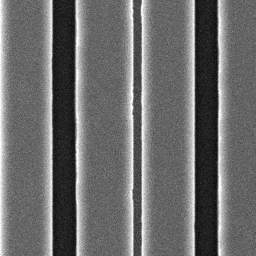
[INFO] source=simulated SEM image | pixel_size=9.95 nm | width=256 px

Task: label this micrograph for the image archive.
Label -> lines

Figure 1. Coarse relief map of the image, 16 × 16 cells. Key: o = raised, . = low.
ooo..ooooooo..oo
ooo..ooooooo..oo
ooo..ooooooo..oo
ooo..ooooooo..oo
ooo..ooooooo..oo
ooo..ooooooo..oo
ooo..ooooooo..oo
ooo..ooooooo..oo
ooo..ooooooo..oo
ooo..ooooooo..oo
ooo..ooooooo..oo
ooo..ooooooo..oo
ooo..ooooooo..oo
ooo..ooooooo..oo
ooo..ooooooo..oo
ooo..ooooooo..oo